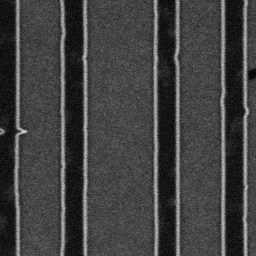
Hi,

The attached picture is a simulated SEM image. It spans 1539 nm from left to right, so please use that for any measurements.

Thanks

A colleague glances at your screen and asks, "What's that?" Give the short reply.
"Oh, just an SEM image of one or a few lines or trenches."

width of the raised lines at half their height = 135 nanometers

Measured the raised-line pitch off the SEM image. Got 0.481 micrometres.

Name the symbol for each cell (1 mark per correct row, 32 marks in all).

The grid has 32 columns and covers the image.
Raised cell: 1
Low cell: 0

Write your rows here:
11000000111000000001110000001110
11000000111000000001110000001110
11000000111000000001110000001110
11000000111000000001110000001110
11000000111000000001110000001110
11000000111000000001110000001110
11000000111000000001110000001110
11000000111000000001110000001110
11000000111000000001110000001110
11000000111000000001110000001110
11000000111000000001110000001110
11000000111000000001110000001110
11000000111000000001110000001110
11000000111000000001110000001110
11000000111000000001110000001110
11000000111000000001110000001110
11100000111000000000110000001110
11000000111000000000110000001110
11000000111000000000110000001110
11000000111000000000110000001110
11000000111000000000110000001110
11000000111000000000110000001110
11000000111000000000110000001110
11000000111000000000110000001110
11000000111000000000110000001110
11000000111000000000110000001110
11000000111000000000110000001110
11000000111000000000110000001110
11000000111000000000110000001110
11000000111000000000110000001110
11000000111000000000110000001110
11000000111000000000110000001110